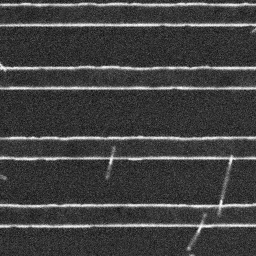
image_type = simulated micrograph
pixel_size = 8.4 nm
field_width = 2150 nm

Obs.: lines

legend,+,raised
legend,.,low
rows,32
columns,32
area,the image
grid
...+......++.++++......+++....+.
++++++++++++++++++++++++++++++++
++++++++++++++++++++++++++++++++
................................
................................
................................
................................
................................
++.++++++++++++++..+++++++++++++
++++++++++++++++++++++++++++++++
++++++++++++++++++++++++++++++++
................................
................................
................................
................................
................................
................................
++++++++++++++++++++++++++++++++
++++++++++++++++++++++++++++++++
++++++++++++++++++++++++++++++++
................................
................................
................................
................................
................................
................................
++++++++++++++++++++++++++++++++
++++++++++++++++++++++++++++++++
................................
................................
................................
................................